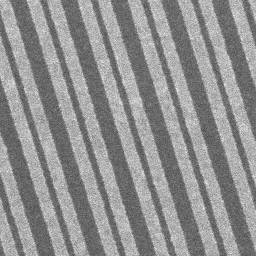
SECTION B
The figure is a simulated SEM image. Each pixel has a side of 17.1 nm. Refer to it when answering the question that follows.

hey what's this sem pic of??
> parallel lines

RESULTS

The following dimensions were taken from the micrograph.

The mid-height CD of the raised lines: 200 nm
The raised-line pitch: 410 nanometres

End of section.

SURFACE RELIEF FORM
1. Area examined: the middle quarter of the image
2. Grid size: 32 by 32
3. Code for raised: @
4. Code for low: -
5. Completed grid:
-@@@----@@@@--@@@----@@@--@@@---
-@@@-----@@@--@@@----@@@---@@@--
--@@@----@@@--@@@-----@@@--@@@--
--@@@----@@@---@@@----@@@--@@@--
--@@@-----@@@--@@@----@@@--@@@--
--@@@-----@@@--@@@-----@@@--@@@-
@--@@@----@@@---@@-----@@@--@@@-
@--@@@-----@@@--@@@----@@@--@@@-
@--@@@@----@@@--@@@-----@@@--@@@
@@--@@@----@@@--@@@-----@@@--@@@
@@--@@@-----@@@--@@@----@@@--@@@
@@--@@@-----@@@--@@@-----@@@--@@
@@@--@@@----@@@--@@@-----@@@--@@
@@@--@@@-----@@@--@@@----@@@--@@
@@@---@@-----@@@--@@@-----@@---@
-@@@--@@@----@@@--@@@-----@@@--@
-@@@--@@@----@@@--@@@@----@@@--@
-@@@--@@@-----@@@--@@@----@@@--@
--@@--@@@-----@@@--@@@-----@@@--
--@@@--@@@----@@@---@@-----@@@--
--@@@--@@@-----@@@--@@@----@@@--
--@@@--@@@-----@@@--@@@-----@@@-
---@@@--@@@----@@@--@@@-----@@@-
---@@@--@@@-----@@@--@@@----@@@-
---@@@--@@@-----@@@--@@@-----@@@
----@@@--@@@----@@@--@@@-----@@@
----@@@--@@@-----@@@--@@@----@@@
----@@@--@@@-----@@@--@@@-----@@
-----@@@--@@@----@@@--@@@-----@@
-----@@@--@@@----@@@@-@@@@----@@
@----@@@--@@@-----@@@--@@@-----@
@-----@@@--@@@----@@@--@@@-----@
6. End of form